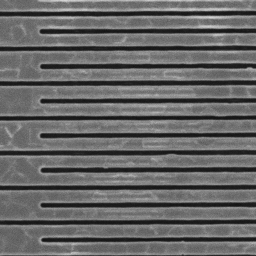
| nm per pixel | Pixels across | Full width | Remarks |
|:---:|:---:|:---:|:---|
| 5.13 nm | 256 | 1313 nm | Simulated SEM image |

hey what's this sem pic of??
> parallel lines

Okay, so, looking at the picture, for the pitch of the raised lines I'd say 0.0892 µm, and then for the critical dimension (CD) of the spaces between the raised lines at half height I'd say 0.025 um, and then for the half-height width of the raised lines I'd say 12.6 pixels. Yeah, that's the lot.